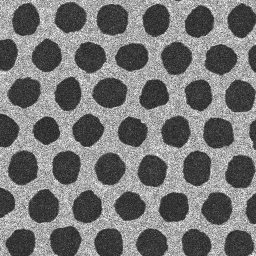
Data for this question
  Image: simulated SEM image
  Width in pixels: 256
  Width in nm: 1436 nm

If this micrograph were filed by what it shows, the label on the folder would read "a regular array of holes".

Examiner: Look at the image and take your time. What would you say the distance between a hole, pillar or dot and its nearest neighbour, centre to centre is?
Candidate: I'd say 236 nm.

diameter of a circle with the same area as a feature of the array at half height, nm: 172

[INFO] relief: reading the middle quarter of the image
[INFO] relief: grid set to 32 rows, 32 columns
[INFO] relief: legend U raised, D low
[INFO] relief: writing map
UUUDDDDDDDUUUUDDDDDDUUUUUDDDDDDU
UUUUUDDDUUUUUUUDDDUUUUUUUUDDDDUU
UUUUUUUUUUUUUUUUUUUUUUUUUUUDDUUU
UDDUUUUUUUUDDUUUUUUUUUUUUUUUUUUU
DDDDUUUUUDDDDDUUUUUUUDDDDUUUUUUU
DDDDUUUUDDDDDDDDUUUUDDDDDDUUUUUD
DDDDUUUDDDDDDDDDUUUUDDDDDDUUUUDD
DDDDDUUDDDDDDDDDUUUDDDDDDDUUUUDD
DDDDUUUDDDDDDDDUUUUDDDDDDDUUUUDD
DDDDUUUUDDDDDDDUUUUDDDDDDDUUUUDD
DDDUUUUUUDDDDDUUUUUDDDDDUUUUUUUD
DDUUUUUUUUUUUUUUUUUUUUUUUUUUUUUU
UUUUUUUUUUUUUUUUUUUUUUUUUUUUUUUU
UUUUDDDDDUUUUUUUDDUUUUUUUUUDDDUU
UUUDDDDDDUUUUUDDDDDDUUUUUDDDDDDU
UUDDDDDDDDUUUUDDDDDDDUUUUDDDDDDU
UUDDDDDDDDUUUDDDDDDDDUUUDDDDDDDU
UUDDDDDDDDUUUUDDDDDDDUUUDDDDDDDD
UUUDDDDDDUUUUUDDDDDDUUUUUDDDDDDU
UUUUDDDDUUUUUUUDDDDDUUUUUDDDDDDU
UUUUUDDUUUUUUUUUUDDUUUUUUUUDDDUU
UUUUUUUUUUUUUUUUUUUUUUUUUUUUUUUU
DDDUUUUUUUDDDUUUUUUUUUUUUUUUUUUD
DDDDUUUUUDDDDDUUUUUUDDDDUUUUUUDD
DDDDUUUUDDDDDDDUUUUDDDDDDUUUUUDD
DDDDUUUUDDDDDDDUUUUDDDDDDDUUUUDD
DDDDUUUUDDDDDDDUUUUDDDDDDDUUUUDD
DDDDUUUUDDDDDDDUUUDDDDDDDDUUUUDD
DDDUUUUUDDDDDDUUUUUDDDDDDUUUUUDD
DDDUUUUUUDDDDDUUUUUDDDDDDUUUUUUD
UUUUUUUUUUUUUUUUUUUUUDDDUUUUUUUU
UUUUUUDUUUUUUUUUUUUUUUUUUUUUUUUU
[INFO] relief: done